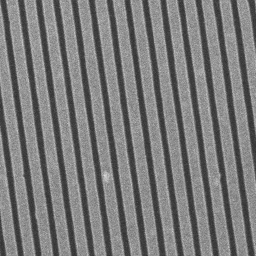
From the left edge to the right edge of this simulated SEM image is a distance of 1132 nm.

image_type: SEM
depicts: parallel lines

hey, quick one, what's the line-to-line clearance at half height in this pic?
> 30.6 nm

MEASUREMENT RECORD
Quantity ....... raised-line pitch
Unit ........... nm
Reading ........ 77.7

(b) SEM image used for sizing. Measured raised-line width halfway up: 0.0466 micrometres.